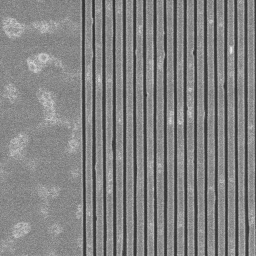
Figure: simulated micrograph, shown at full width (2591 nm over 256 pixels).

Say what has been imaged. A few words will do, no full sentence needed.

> parallel lines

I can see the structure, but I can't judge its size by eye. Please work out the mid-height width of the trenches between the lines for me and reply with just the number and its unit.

27.8 nm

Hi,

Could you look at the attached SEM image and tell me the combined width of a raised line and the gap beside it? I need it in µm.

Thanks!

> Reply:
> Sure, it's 0.103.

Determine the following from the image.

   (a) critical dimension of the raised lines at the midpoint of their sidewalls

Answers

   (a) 0.0747 micrometres